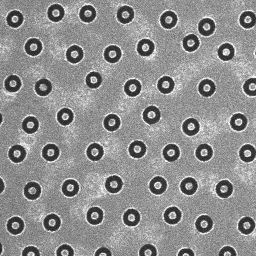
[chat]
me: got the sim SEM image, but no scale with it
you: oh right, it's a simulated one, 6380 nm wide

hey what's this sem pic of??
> a regular array of ring-shaped grooves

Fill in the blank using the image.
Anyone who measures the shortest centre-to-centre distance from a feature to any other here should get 826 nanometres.